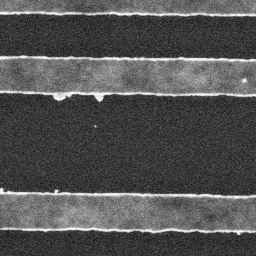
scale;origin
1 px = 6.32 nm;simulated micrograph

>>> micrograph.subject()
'lines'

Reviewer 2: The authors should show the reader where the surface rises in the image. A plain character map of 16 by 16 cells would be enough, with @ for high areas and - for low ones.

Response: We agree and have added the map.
@@@@@@@@@@@@@@@@
----------------
----------------
----------------
@@@@@@@@@@@@@@@@
@@@@@@@@@@@@@@@@
----------------
----------------
----------------
----------------
----------------
----------------
@@@@@@@@@@@@@@@@
@@@@@@@@@@@@@@@@
----------------
----------------